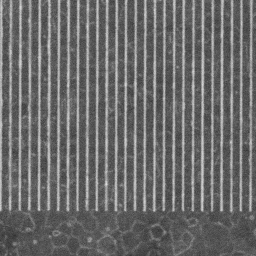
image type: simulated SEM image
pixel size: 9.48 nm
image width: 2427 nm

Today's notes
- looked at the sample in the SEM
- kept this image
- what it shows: parallel lines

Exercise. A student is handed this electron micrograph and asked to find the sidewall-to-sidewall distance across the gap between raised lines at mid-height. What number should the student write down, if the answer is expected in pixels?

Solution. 7.88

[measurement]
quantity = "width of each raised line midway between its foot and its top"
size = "0.0142 microns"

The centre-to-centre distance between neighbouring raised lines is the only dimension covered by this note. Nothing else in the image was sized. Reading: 91.1 nm